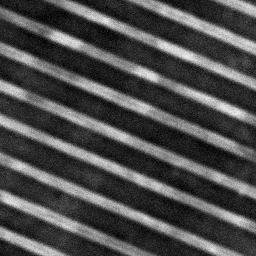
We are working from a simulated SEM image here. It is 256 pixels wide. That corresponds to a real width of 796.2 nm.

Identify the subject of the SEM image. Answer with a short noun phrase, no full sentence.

parallel lines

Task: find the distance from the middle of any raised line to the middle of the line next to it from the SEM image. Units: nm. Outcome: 104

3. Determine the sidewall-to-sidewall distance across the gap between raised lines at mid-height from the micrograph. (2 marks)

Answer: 25.6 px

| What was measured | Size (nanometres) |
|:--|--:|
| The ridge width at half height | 23.6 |